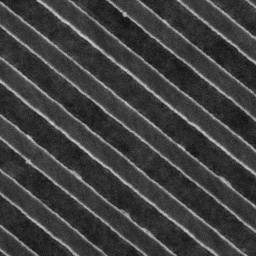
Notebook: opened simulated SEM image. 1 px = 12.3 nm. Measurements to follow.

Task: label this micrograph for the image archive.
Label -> lines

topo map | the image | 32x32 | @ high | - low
-----@@@@-----@@@@-----@@@@----@
@@-----@@@@----@@@@-----@@@@----
@@@-----@@@@----@@@@-----@@@@---
@@@@-----@@@@-----@@@@----@@@@--
-@@@@-----@@@@-----@@@@-----@@@@
---@@@@----@@@@-----@@@@-----@@@
----@@@@-----@@@@----@@@@-----@@
@----@@@@-----@@@@-----@@@@----@
@@----@@@@-----@@@@-----@@@@----
@@@-----@@@@----@@@@-----@@@@---
@@@@-----@@@@-----@@@@----@@@@--
--@@@-----@@@@-----@@@@-----@@@@
---@@@@----@@@@-----@@@@-----@@@
----@@@@-----@@@@----@@@@-----@@
-----@@@@-----@@@@-----@@@@----@
@@----@@@@-----@@@@-----@@@@----
@@@-----@@@@----@@@@-----@@@@---
@@@@-----@@@@-----@@@@----@@@@--
-@@@@-----@@@@-----@@@@-----@@@@
---@@@@----@@@@@----@@@@-----@@@
----@@@@-----@@@@----@@@@-----@@
-----@@@@-----@@@@-----@@@@----@
@@----@@@@-----@@@@-----@@@@----
@@@-----@@@@----@@@@-----@@@@---
@@@@-----@@@@-----@@@@----@@@@--
--@@@-----@@@@-----@@@@-----@@@@
---@@@@----@@@@-----@@@@-----@@@
----@@@@-----@@@-----@@@@-----@@
-----@@@@-----@@@@-----@@@@----@
@@----@@@@-----@@@@-----@@@@----
@@@-----@@@@----@@@@-----@@@@---
@@@@-----@@@@-----@@@-----@@@@--